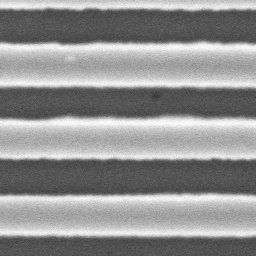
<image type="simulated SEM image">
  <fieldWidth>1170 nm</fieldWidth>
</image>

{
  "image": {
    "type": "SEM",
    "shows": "lines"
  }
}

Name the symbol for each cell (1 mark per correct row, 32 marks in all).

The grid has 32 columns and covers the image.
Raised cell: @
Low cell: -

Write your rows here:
@@@@@@@@@@@@@@@@@@@@@@@@@@@@@@@@
--------------------------------
--------------------------------
--------------------------------
--------------------------------
--------------------------------
@@@@@@@@@@@@@@@@@@@@@@@@@@@@@@@@
@@@@@@@@@@@@@@@@@@@@@@@@@@@@@@@@
@@@@@@@@@@@@@@@@@@@@@@@@@@@@@@@@
@@@@@@@@@@@@@@@@@@@@@@@@@@@@@@@@
@---@@@@@---@@@@@@@@@@@@@@@@@@@@
--------------------------------
--------------------------------
--------------------------------
--------------------------------
@@@@@@@@@@@@@@@@@@@@@@@@@@@@@@@@
@@@@@@@@@@@@@@@@@@@@@@@@@@@@@@@@
@@@@@@@@@@@@@@@@@@@@@@@@@@@@@@@@
@@@@@@@@@@@@@@@@@@@@@@@@@@@@@@@@
@@@@@@@@@@@@@@@@@@@@@@@@@@@@@@@@
--------------------------------
--------------------------------
--------------------------------
--------------------------------
--------------------------------
@@@@@@@@@@@@@@@@@@@@@@@@@@@@@@@@
@@@@@@@@@@@@@@@@@@@@@@@@@@@@@@@@
@@@@@@@@@@@@@@@@@@@@@@@@@@@@@@@@
@@@@@@@@@@@@@@@@@@@@@@@@@@@@@@@@
--------------------------------
--------------------------------
--------------------------------